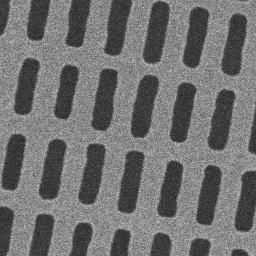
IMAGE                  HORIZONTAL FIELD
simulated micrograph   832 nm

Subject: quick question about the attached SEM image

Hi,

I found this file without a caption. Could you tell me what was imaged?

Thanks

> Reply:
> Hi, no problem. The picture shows a regular array of holes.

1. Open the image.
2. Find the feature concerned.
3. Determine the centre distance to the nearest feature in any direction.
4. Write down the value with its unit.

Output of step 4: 128 nm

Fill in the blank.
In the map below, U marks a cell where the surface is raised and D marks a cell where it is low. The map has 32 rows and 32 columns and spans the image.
DUUUDDUUUDDUUUDDUUUDDUUUUUUUUUUU
DUUUDDUUUDDUUUDDUUUDDUUUDDUUUUUU
DUUUDDUUUDDUUDDDUUUDDUUUDDUUUDDU
DUUDDDUUDDDUUDDDUUDDDUUUDDUUUDDU
UUUDDUUUDDDUUDDDUUDDDUUDDDUUDDDU
UUUUUUUUDDUUUDDDUUDDDUUDDDUUDDDU
UUUUUUUUUUUUUDDUUUDDUUUDDUUUDDUU
UUUDDUUUUUUUUUUUUUDDUUUDDUUUDDUU
UUUDDUUUDDUUUUUUUUUUUUUUUUUUDDUU
UUDDDUUUDDUUDDDUUUDUUUUUUUUUUUUU
UUDDDUUDDDUUDDDUUDDDUUUDUUUUUUUU
UUDDUUUDDUUUDDUUUDDDUUDDUUUDDUUU
UUDDUUUDDUUUDDUUUDDUUUDDUUUDDUUU
UUDDUUUDDUUUDDUUUDDUUUDDUUUDDUUU
UUUUUUUDDUUUDDUUDDDUUUDDUUUDDUUU
UUUUUUUUUUUDDDUUDDDUUDDDUUDDDUUU
UUUUUUUUUUUUUUUUDDDUUDDDUUDDDUUD
UDDUUUUDUUUUUUUUUUUUUDDUUUDDDUUD
UDDUUUDDUUUDDUUUUUUUUUUUUUDDUUUD
UDDUUUDDUUUDDUUUDDUUUUUUUUUUUUUU
DDDUUUDDUUUDDUUUDDUUUDDUUUUUUUUU
DDDUUDDDUUDDDUUDDDUUUDDUUUDDUUUD
DDUUUDDDUUDDDUUDDDUUUDDUUDDDUUDD
DDUUUDDUUUDDUUUDDUUUDDDUUDDDUUDD
UUUUUDDUUUDDUUUDDUUUDDUUUDDUUUDD
UUUUUUUUUUUUUUUDDUUUDDUUUDDUUUDD
DDUUUUUUUUUUUUUDDUUUDDUUUDDUUUDD
DDUUDDDUUUUUUUUUUUUUUUUUUDDUUDDD
DDUUDDDUUDDUUUUUUUUUUUUUUUUUUUDU
DUUUDDDUUDDUUUDDUUUDDUUUUUUUUUUU
DUUUDDUUUDDUUUDDUUUDDUUUDDUUUUUU
DUUUDDUUUDDUUUDDUUUDDUUUDDUUUDDU